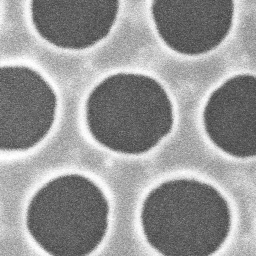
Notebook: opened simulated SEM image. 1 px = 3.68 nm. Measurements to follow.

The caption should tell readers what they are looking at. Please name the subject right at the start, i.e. holes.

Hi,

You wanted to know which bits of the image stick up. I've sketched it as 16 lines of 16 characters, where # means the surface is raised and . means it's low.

##.....##......#
##.....###.....#
###...####....##
################
..##############
...###....####..
....#......##...
...##......##...
...###....###...
.######..#####..
################
###...####...###
##.....##.....##
##.....##......#
##.....##.....##
###...###.....##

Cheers